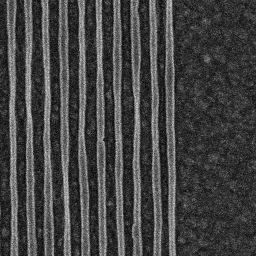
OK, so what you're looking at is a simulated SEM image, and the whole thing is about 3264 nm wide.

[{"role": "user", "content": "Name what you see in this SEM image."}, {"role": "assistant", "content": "parallel lines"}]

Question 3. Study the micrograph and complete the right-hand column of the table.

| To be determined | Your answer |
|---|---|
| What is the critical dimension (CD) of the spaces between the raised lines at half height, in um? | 0.148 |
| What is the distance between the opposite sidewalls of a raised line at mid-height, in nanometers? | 68.5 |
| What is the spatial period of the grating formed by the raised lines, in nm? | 224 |